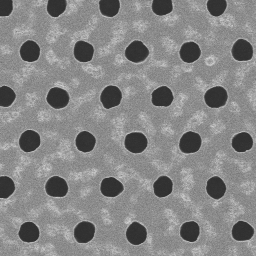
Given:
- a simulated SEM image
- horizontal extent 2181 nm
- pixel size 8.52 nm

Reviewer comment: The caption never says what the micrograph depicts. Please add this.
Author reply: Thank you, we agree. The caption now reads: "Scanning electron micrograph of a regular array of holes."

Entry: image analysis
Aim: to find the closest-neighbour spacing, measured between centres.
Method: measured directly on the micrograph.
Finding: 51.6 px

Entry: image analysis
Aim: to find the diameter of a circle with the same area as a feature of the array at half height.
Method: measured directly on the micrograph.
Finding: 0.178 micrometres